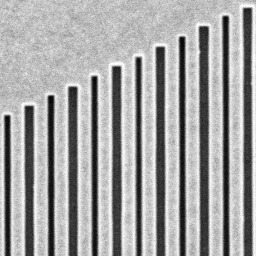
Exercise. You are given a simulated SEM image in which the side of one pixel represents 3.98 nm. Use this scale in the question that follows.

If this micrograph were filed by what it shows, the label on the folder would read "parallel lines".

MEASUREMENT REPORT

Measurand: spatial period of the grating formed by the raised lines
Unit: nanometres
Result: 86.4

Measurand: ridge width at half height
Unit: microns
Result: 0.0517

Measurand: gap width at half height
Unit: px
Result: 9.5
